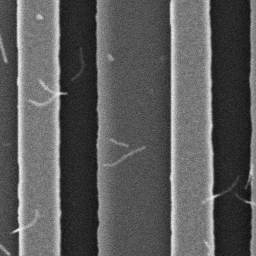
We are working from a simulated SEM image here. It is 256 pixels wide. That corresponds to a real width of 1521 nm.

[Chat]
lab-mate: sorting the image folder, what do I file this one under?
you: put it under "lines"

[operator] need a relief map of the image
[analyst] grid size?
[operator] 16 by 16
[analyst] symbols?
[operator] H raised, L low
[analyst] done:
HHHHLLHHHHHHHLLL
HHHHLLHHHHHHHLLL
HHHHLLHHHHHHHLLL
HHHHLLHHHHHHHLLL
HHHHLLHHHHHHHLLL
HHHHLLHHHHHHHLLL
HHHHLLHHHHHHHLLL
HHHHLLHHHHHHHLLL
HHHHLLHHHHHHHLLL
HHHHLLHHHHHHHLLL
HHHHLLHHHHHHHLLL
HHHHLLHHHHHHHLLL
HHHHLLHHHHHHHLLL
HHHHLLHHHHHHHLLL
HHHHLLHHHHHHHLLL
HHHHLLHHHHHHHLLL